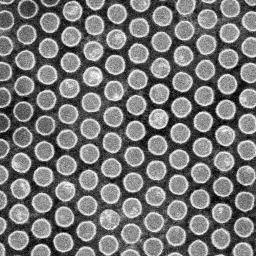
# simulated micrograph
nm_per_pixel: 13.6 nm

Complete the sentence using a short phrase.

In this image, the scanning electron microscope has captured a regular array of raised bodies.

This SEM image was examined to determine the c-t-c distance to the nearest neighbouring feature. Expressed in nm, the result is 344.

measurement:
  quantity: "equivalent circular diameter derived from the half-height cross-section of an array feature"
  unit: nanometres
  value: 263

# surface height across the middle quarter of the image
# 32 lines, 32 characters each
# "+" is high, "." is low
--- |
++++......+++++.......++++......
+++...+++..++++.......++++......
.....++++...++...+++..++++..+++.
.....+++++......+++++...+..+++++
+++..++++..+++..+++++......+++++
++++...+...++++..+++..+++..+++++
++++......+++++.......++++..+++.
+++...++..+++++......+++++......
.....++++..+++...+++..++++...+..
....+++++.......++++...++..++++.
++...++++.......++++.......+++++
+++..+++...+++..++++...++..+++++
+++.......+++++..++...++++..+++.
+++.......+++++......+++++......
++...+++..++++...++..+++++......
....+++++...++..++++..+++..+++..
....+++++.......++++.......++++.
+++..++++..++...++++.......++++.
+++...+...++++..++++..+++..++++.
+++.......++++.......++++...++..
+++..+++..++++.......+++++......
....+++++..+++..+++..+++++......
....+++++......+++++...++..++++.
++..+++++......+++++......+++++.
+++..+++..+++...++++..++..+++++.
+++......+++++...+...++++..+++..
+++......+++++.......++++.......
+...++++..++++..++...++++.......
....++++.......++++...+++..+++..
....++++.......+++++......+++++.
++...+++..+++..+++++......+++++.
+++......+++++..+++..++++..++++.